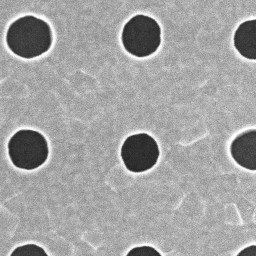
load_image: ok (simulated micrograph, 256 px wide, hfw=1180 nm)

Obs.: holes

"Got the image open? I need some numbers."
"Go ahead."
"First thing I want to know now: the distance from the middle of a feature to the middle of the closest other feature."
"516 nanometres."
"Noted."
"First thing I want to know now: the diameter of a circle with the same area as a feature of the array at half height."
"188 nm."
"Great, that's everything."